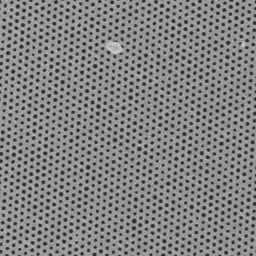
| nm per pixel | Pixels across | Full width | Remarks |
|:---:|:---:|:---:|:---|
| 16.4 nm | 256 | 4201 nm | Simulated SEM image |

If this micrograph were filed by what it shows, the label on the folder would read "a regular array of holes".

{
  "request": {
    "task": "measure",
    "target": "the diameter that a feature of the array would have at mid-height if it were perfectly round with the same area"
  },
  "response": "64.1 nanometers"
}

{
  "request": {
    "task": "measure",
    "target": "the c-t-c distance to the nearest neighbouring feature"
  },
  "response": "115 nm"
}